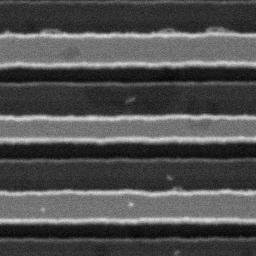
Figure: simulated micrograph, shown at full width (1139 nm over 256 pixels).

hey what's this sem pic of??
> lines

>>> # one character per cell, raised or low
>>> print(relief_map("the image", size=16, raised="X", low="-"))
----------------
----------------
XXXXXXXXXXXXXXXX
XXXXXXXXXXXXXXXX
----------------
----------------
----------------
XXXXXXXXXXXXXXXX
XXXXXXXXXXXXXXXX
----------------
----------------
----------------
XXXXXXXXXXXXXXXX
XXXXXXXXXXXXXXXX
----------------
----------------